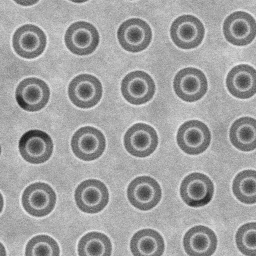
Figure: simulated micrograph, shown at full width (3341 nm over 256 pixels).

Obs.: an array of small figures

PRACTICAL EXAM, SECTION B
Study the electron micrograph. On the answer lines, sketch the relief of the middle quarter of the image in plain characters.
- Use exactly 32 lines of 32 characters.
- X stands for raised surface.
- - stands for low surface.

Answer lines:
XXXXXXXXXXXXXXXXXXXXXXXXXXXXXXXX
XXXXXXXXXXXXXXXXXX-XXXXXXXXXX---
XXXX---XXXXXXXXX-----XXXXXXX----
XX------XXXXXXX-------XXXXX---XX
X----X---XXXXX---XXX---XXXX--XXX
X--XXXX---XXXX--XXXXX--XXXX--XXX
X--XXXXX--XXXX--XXXXX--XXXX---XX
X--XXXXX--XXXX---XXX---XXXXX----
X---XXX--XXXXXX-------XXXXXXX---
XX-------XXXXXXX-----XXXXXXXXX--
XXX-----XXXXXXXXXXXXXXXXXXXXXXXX
XXXXXXXXXXXXXXXXXXXXXXXXXXXXXXXX
XXXXXXXXXXXXXXXXXXXXXXXXXXXXXXXX
XXXXXXXXXXXXXXXXXXXXXXXXXXXXXXXX
XXXXXXXXXXXXXXXXXXXXXXXXXXXXXX--
XXXXX--XXXXXXXXXX-----XXXXXXX---
XXX------XXXXXXX-------XXXXX---X
XX--------XXXXX---XXX--XXXXX--XX
XX--XXXX--XXXXX--XXXX---XXXX--XX
XX--XXXX---XXXX--XXXXX--XXXX--XX
X---XXXX---XXXX--XXXX---XXXX---X
XX--XXXX--XXXXX--------XXXXXX---
XX--------XXXXXX------XXXXXXXXX-
XXX------XXXXXXXXXX-XXXXXXXXXXXX
XXXXXXXXXXXXXXXXXXXXXXXXXXXXXXXX
XXXXXXXXXXXXXXXXXXXXXXXXXXXXXXXX
XXXXXXXXXXXXXXXXXXXXXXXXXXXXXXXX
XXXXXXXXXXXXXXXXXXXXXXXXXXXXXXX-
XXXXXXXXXXXXXXXXXX----XXXXXXXX--
XXXX------XXXXXXX------XXXXXX---
XXX--------XXXXX--XXXX--XXXXX--X
XXX--XXXX--XXXXX--XXXX--XXXXX--X